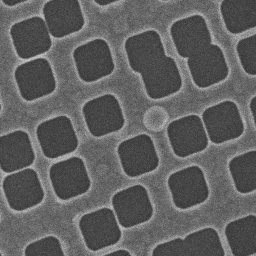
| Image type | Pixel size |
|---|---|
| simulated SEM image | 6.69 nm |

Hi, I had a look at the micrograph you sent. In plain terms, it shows a regular array of holes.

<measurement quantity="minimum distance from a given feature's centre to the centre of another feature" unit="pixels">47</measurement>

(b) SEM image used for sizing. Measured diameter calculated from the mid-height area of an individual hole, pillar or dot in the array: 275 nm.